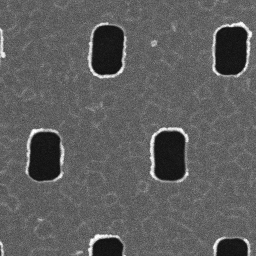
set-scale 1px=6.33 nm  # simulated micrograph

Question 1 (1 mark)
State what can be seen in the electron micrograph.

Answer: holes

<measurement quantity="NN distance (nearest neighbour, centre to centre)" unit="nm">772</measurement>